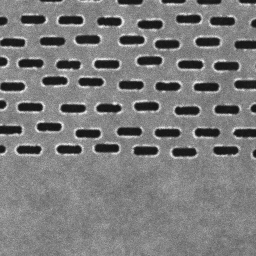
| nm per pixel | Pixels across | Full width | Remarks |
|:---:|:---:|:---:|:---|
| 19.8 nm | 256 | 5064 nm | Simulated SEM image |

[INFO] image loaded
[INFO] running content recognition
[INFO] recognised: a regular array of holes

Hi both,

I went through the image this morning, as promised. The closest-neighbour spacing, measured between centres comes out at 506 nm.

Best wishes